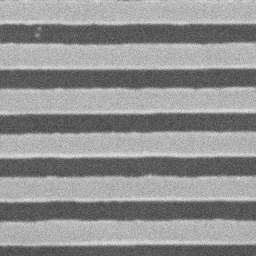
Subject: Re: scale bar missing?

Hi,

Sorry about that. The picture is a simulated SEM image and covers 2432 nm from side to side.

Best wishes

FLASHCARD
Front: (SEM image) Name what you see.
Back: lines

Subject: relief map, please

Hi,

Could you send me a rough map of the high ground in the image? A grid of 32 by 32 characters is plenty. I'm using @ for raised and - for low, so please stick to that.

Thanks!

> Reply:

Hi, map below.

@@@@@@@@@@@@@@@@@@@@@@@@@@@@@@@@
@@@@@@@@@@@@@@@@@@@@@@@@@@@@@@@@
@@@@@@@@@@@@@@@@@@@@@@@@@@@@@@@@
--------------------------------
--------------------------------
-@--------------------------@@@@
@@@@@@@@@@@@@@@@@@@@@@@@@@@@@@@@
@@@@@@@@@@@@@@@@@@@@@@@@@@@@@@@@
@@@@@@@@@@@@@@@@@@@@@@@@@@------
--------------------------------
--------------------------------
@@@@@@@@@@@@@@@@@@@@@@@@@@@@@@@@
@@@@@@@@@@@@@@@@@@@@@@@@@@@@@@@@
@@@@@@@@@@@@@@@@@@@@@@@@@@@@@@@@
--------------------------------
--------------------------------
--------------------------------
@@@@@@@@@@@@@@@@@@@@@@@@@@@@@@@@
@@@@@@@@@@@@@@@@@@@@@@@@@@@@@@@@
@@@@@@@@@@@@@@@@@@----@@@-@-----
--------------------------------
--------------------------------
@@@@@@@@@@@@@@@@@@@@@@@@@@@@@@@@
@@@@@@@@@@@@@@@@@@@@@@@@@@@@@@@@
@@@@@@@@@@@@@@@@@@@@@@@@@@@@@@@@
--------------------------------
--------------------------------
--------------------------@@----
@@@@@@@@@@@@@@@@@@@@@@@@@@@@@@@@
@@@@@@@@@@@@@@@@@@@@@@@@@@@@@@@@
@@@@@@@@@@@@@@@@----------------
--------------------------------